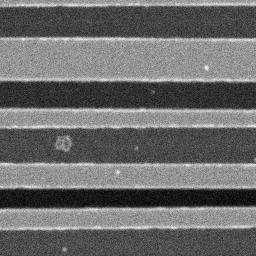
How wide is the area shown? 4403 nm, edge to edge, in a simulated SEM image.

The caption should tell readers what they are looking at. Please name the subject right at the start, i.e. lines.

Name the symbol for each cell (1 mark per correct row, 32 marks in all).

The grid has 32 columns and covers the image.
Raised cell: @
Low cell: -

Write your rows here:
@@@@@@@@@@@@@@@@@@@@@@@@@@@@@@@@
--------------------------------
--------------------------------
--------------------------------
--------------------------------
@@@@@@@@@@@@@@@@@@@@@@@@@@@@@@@@
@@@@@@@@@@@@@@@@@@@@@@@@@@@@@@@@
@@@@@@@@@@@@@@@@@@@@@@@@@@@@@@@@
@@@@@@@@@@@@@@@@@@@@@@@@@@@@@@@@
@@@@@@@@@@@@@@@@@@@@@@@@@@@@@@@@
--------------------------------
--------------------------------
--------------------------------
--------------------------------
@@@@@@@@@@@@@@@@@@@@@@@@@@@@@@@@
@@@@@@@@@@@@@@@@@@@@@@@@@@@@@@@@
--------------------------------
--------------------------------
--------------------------------
--------------------------------
@@--@@-@-@@@--------------------
@@@@@@@@@@@@@@@@@@@@@@@@@@@@@@@@
@@@@@@@@@@@@@@@@@@@@@@@@@@@@@@@@
--------------------------@-----
--------------------------------
--------------------------------
@@@@@@@@@@@@@@@@@@@@@@@@@@@@@@@@
@@@@@@@@@@@@@@@@@@@@@@@@@@@@@@@@
@@@@@@@@@@@@@@@@@@@--@----------
--------------------------------
--------------------------------
--------------------------------